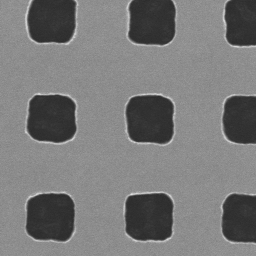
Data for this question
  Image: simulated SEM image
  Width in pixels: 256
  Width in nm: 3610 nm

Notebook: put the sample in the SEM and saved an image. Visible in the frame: holes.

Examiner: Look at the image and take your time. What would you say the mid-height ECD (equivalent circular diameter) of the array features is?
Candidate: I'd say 729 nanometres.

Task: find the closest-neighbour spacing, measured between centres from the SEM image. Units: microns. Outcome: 1.38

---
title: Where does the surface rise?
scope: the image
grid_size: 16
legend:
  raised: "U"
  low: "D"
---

UUDDDUUUDDDUUUDD
UUDDDUUUDDDUUUDD
UUDDUUUUDDDUUUDD
UUUUUUUUUUUUUUUU
UUUUUUUUUUUUUUUU
UUUUUUUUUUUUUUUU
UUDDDUUUDDDUUUDD
UUDDDUUUDDDUUUDD
UUDDUUUUDDDUUUDD
UUUUUUUUUUUUUUUU
UUUUUUUUUUUUUUUU
UUUUUUUUUUUUUUUU
UUDDUUUUDDDUUUDD
UUDDDUUUDDDUUUDD
UUDDDUUUDDDUUUDD
UUUUUUUUUUUUUUUU